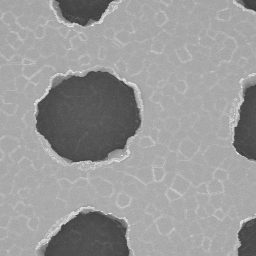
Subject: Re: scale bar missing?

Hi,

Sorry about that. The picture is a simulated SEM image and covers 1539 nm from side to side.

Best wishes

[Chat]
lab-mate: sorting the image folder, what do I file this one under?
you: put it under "holes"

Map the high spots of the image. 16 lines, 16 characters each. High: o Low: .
oooo...oooooooo.
oooooooooooooooo
oooooooooooooooo
oooooooooooooooo
oooooooooooooooo
ooo.....ooooooo.
oo.......oooooo.
oo.......oooooo.
ooo.....ooooooo.
ooo....oooooooo.
oooooooooooooooo
oooooooooooooooo
oooooooooooooooo
ooooo..ooooooooo
oooo....ooooooo.
ooo.....ooooooo.